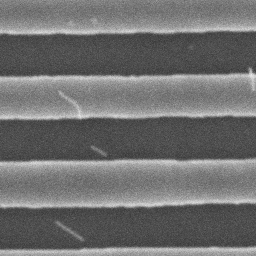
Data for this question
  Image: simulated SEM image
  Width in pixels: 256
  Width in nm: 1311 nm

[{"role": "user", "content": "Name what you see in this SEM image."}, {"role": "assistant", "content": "lines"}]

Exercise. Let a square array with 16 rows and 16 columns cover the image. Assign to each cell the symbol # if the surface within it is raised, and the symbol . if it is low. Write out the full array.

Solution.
################
################
................
................
................
################
################
................
................
................
################
################
################
................
................
.............#.#